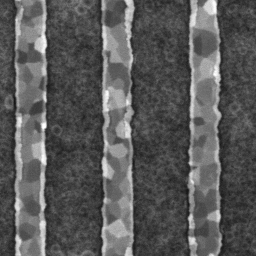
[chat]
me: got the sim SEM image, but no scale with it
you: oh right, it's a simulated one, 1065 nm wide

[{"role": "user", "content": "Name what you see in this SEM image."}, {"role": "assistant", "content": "one or a few lines or trenches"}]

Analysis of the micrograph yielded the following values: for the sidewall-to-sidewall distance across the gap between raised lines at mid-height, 247 nanometers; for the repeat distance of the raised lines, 87.1 px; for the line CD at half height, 0.116 microns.